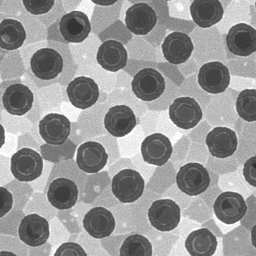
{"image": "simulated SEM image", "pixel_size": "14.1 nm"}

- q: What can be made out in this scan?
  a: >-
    a regular array of ring-shaped grooves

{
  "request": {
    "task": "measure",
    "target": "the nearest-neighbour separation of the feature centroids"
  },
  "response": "644 nm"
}